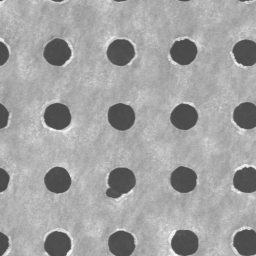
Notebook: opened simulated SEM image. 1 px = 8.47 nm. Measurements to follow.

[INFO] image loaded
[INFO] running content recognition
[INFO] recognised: a regular array of holes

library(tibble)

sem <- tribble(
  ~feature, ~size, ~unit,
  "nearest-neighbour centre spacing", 533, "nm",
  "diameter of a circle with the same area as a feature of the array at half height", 229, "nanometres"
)